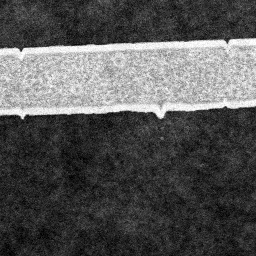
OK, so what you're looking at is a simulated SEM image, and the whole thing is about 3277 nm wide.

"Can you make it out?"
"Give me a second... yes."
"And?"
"one or a few lines or trenches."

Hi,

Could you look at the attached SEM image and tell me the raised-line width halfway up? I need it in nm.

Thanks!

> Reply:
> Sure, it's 782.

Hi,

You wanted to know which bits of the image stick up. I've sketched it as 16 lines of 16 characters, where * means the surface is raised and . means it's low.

................
................
................
****************
****************
****************
***************.
................
................
................
................
................
................
................
................
................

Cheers